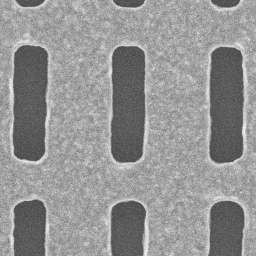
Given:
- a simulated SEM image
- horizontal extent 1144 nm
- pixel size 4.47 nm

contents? holes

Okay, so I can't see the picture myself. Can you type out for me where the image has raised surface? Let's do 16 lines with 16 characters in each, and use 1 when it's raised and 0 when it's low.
1111111111111111
1111111111111111
1111111111111111
1001111001111001
1001111001111001
1001111001111001
1001111001111001
1001111001111001
1001111001111001
1001111001111001
1111111111111111
1111111111111111
1111111111111111
1001111001111001
1001111001111001
1001111001111001